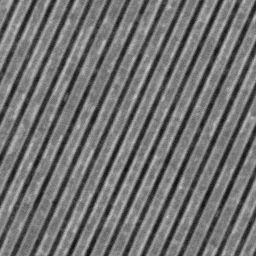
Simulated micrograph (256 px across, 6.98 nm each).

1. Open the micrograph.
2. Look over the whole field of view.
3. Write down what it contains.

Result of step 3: parallel lines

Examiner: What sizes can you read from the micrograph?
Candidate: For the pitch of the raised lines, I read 118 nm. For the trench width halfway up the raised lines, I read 0.0533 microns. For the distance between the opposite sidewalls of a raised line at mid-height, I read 65.2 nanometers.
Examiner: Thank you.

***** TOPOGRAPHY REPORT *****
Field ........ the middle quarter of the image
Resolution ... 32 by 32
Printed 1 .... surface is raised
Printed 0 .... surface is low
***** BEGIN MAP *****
11100111001100111001110111001110
11000110011100110001100111001100
11001110011000110011100110011100
11001100111001110011001110011101
10011100110001100111001100111001
10011001110011100110011100111001
00111001110011001110011101110011
00110001100111001100111001110011
01110011100110011100111001100111
01110011001110011001110011100110
01100111001100011001110011001110
11100110011100111001100111001110
11001110011000110011100110011100
11001100011001110011001110011100
10011100111001100111001110011001
10011000110011100110011100111001
00011001110011001110011100110011
00111001100111001110011001110011
00110011100110011100111001100111
01110011000110011100110011100110
01100111001110111001110011101110
11100110001100111001100111001110
11000110011100110011100111001100
11001110011001110011101110011100
10001100111001100111001110011001
10011100110011100111001100111001
10011001110011101110011100110011
00111001100111001110011001110011
00110011100111001100111001110011
01110011001110011100110011100111
01100011001110011001110011100110
11100111001100111001110011001110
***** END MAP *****